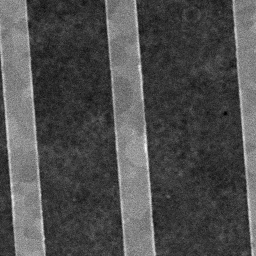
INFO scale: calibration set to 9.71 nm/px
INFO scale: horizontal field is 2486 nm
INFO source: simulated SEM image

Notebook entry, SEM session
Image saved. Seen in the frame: one or a few lines or trenches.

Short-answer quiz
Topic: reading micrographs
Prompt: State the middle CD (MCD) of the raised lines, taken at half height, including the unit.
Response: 289 nanometers